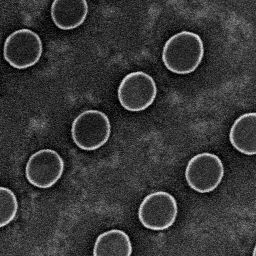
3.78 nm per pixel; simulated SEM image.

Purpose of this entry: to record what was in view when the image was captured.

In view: raised bodies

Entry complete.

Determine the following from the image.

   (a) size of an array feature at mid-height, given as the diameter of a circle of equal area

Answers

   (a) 0.142 µm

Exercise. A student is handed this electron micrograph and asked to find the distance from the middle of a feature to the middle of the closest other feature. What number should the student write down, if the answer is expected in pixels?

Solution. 60.3